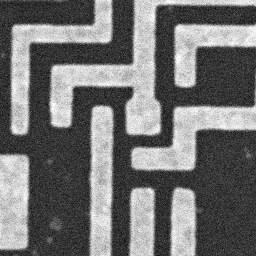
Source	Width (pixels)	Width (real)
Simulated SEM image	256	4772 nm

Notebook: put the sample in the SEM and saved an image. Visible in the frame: wiring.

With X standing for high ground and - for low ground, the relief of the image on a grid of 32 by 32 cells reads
------------XX---XXX-----------X
------------XX---XX-------------
------------XX---XX-------------
--XXXXXXXXXXXX---XX---XXXXXXXXXX
--XXXXXXXXXXXX---XX---XXXXXXXXXX
--XX-------------XX---XXXXXXXXXX
--XX-------------XX---XX--------
--XX-------------XX---XX--------
--XX---XXXXXXXXXXXX---XX--------
--XX---XXXXXXXXXXXX---XX--------
--XX---XXXXXXXXXXXX---XX--------
--X----XX--------XX-------------
--X---XXX-------XXX-------------
--X---XXX---X---XXXX----XXX----X
--X----XX---XX--XXXX--XXXXXXXXXX
--X----XX---XX--XXXX--XXXXXXXXXX
--X---------XX--XXXX--XXX-------
------------XX--------XX--------
------------XX-------XXX--------
------------XX---XXXXXXX--------
XXX---------XX---XXXXXXX--------
XXX--------XXX------------------
XXX--------XXX------------------
XXX--------XXX------------------
XXX---------XX--XXX---XX--------
XXX---------XX--XXX---XX--------
XXX--------XXX--XXX---XX--------
XXX--------XXX--XXX---XX--------
XXX---------XX--XXX---XX--------
XXX--------XXX--XXX---XX--------
XXX--------XXX--XXX---XX--------
-----------XXX--XXX---XX--------